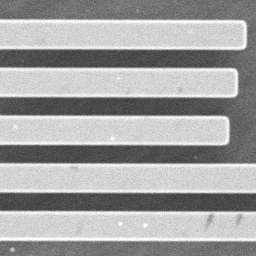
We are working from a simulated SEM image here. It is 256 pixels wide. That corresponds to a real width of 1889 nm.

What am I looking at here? groups of lines, slits or small figures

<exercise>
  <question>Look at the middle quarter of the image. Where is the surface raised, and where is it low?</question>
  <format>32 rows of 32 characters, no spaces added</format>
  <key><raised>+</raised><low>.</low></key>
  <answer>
................................
++++++++++++++++++++++++++++++++
++++++++++++++++++++++++++++++++
++++++++++++++++++++++++++++++++
++++++++++++++++++++++++++++++++
++++++++++++++++++++++++++++++++
++++++++++++++++++++++++++++++++
++++++++++++++++++++++++++++++++
................................
................................
................................
................................
................................
++++++++++++++++++++++++++++++++
++++++++++++++++++++++++++++++++
++++++++++++++++++++++++++++++++
++++++++++++++++++++++++++++++++
++++++++++++++++++++++++++++++++
++++++++++++++++++++++++++++++++
++++++++++++++++++++++++++++++++
................................
................................
................................
................................
................................
++++++++++++++++++++++++++++++++
++++++++++++++++++++++++++++++++
++++++++++++++++++++++++++++++++
++++++++++++++++++++++++++++++++
++++++++++++++++++++++++++++++++
++++++++++++++++++++++++++++++++
++++++++++++++++++++++++++++++++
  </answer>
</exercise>